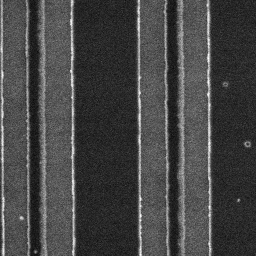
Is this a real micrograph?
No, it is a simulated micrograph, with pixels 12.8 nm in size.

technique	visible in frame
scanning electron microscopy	lines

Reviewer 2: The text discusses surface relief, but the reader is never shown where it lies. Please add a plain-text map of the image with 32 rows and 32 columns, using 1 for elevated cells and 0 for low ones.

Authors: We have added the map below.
00011000011111111000011000111111
00011000011111111000011000111111
00011000011111111000011000111111
00011000011111111000011000111111
00011000011111111000011000111111
00011000011111111000011000111111
00011000011111111000011000111111
00011000011111111000011000111111
00011000011111111000011000111111
00011000011111111000011000111111
00011000011111111000011000111111
00011000011111111000011000111111
00011000011111111000011000111111
00011000011111111000011000111111
00001000011111111000011000111111
00011000011111111000011000111111
00011000011111111000011000111111
00001000011111111000011000111111
00001000011111111000011000111111
00011000011111111000011000111111
00011000011111111000011000111111
00001000011111111000011000111111
00001000011111111000011000111111
00001000011111111000011000111111
00001000011111111000011000111111
00001000011111111000011000111111
00001000011111111100011000111111
00001000011111111100011000111111
00001000011111111000011000111111
00001000011111111100011000111111
00001000011111111100011000111111
00001000011111111100011000111111